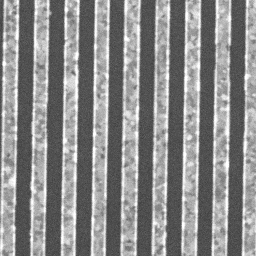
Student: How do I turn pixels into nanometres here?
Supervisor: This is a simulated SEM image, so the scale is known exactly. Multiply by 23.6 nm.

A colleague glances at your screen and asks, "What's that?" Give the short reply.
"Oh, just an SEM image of parallel lines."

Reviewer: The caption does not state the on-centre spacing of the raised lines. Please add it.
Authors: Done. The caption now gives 0.713 microns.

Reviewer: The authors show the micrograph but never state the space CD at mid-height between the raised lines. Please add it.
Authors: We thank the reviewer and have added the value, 412 nanometers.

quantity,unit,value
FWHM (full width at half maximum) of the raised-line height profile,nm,297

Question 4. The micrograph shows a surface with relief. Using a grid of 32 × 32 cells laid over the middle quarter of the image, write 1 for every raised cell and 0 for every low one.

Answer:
01100000111000011100000111000001
01100000111000011100000111000001
01100000111000011100000111000011
01100000111000011100000111000011
01100000111000011100000111000011
01100000111000011100000111000011
11100000111000011100000111000011
11100000111000011100000111000011
11100000111000011100000111000011
11100000111000011100000111000011
11100000111000011100000111000011
11100000111000011100000111000011
11100000111000011100000111000011
11100000111000011100000111000011
11100000111000011100000111000011
11100000111000011100000111000011
11100000111000011100000111000011
11100000111000011100000111000011
11100000111000011100000111000011
11100000111000011100000111000011
11100000110000011100000111000011
11100000110000011100000111000011
11100000110000011100000111000011
11100000110000011100000111000011
11100001110000011100000111000011
11100001110000011100000110000011
11100001110000011100000110000011
11100001110000011100000110000011
11100001110000011100000110000011
11100001110000011100000110000011
11100001110000011100000110000011
11100001110000011100000110000011